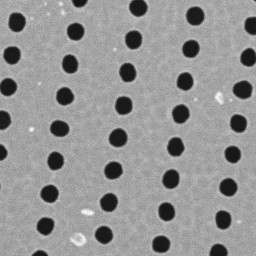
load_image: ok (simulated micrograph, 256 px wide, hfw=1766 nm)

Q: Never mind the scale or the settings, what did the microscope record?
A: a regular array of holes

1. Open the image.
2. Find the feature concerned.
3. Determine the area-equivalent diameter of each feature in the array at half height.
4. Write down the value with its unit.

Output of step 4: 128 nm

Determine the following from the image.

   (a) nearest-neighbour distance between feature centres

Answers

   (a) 227 nm